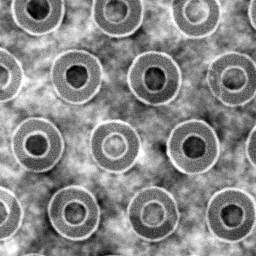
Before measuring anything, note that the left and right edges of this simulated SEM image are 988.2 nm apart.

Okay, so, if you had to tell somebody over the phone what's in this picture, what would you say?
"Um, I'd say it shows ring-shaped raised bodies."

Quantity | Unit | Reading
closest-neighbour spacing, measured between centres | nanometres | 299